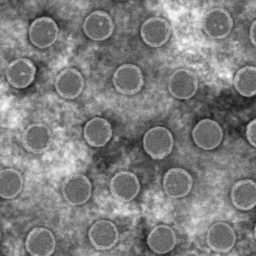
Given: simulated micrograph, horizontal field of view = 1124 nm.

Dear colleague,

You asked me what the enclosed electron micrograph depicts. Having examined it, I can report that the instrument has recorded a regular array of raised bodies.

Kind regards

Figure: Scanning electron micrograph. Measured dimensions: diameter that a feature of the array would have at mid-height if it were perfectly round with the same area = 127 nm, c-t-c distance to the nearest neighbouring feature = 237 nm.